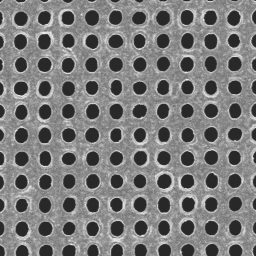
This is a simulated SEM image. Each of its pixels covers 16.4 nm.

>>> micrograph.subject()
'a regular array of holes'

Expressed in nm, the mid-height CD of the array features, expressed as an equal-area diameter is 228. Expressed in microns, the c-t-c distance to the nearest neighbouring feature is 0.381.